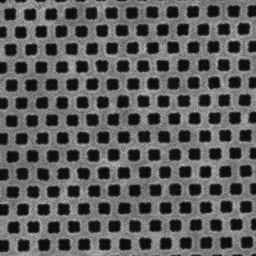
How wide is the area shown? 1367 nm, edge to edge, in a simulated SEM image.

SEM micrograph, a regular array of holes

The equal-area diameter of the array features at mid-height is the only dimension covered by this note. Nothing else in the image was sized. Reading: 0.0648 micrometres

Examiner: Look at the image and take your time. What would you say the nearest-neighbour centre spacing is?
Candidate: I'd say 0.106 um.